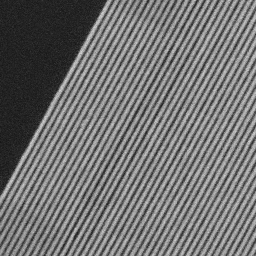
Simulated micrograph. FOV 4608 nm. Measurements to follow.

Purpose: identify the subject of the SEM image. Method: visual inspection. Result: parallel lines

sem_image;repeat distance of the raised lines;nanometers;111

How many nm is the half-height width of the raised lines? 65.2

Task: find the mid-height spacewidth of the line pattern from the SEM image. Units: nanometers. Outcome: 49.4